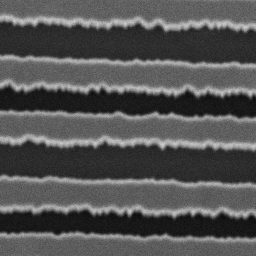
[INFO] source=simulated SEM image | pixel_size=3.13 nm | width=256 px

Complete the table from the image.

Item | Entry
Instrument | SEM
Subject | lines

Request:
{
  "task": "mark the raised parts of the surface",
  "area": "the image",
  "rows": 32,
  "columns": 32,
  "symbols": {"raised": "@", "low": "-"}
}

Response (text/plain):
@@@@@@@@@@@@@@@@@@@@@@@@@@@@@@@@
@@@@@@@@@@@@@@@@@@@@@@@@@@@@@@@@
@@@@@@@@@@@@@@@@@@@@@@@@@@@@@@@@
------------------@-@@@------@@@
--------------------------------
--------------------------------
--------------------------------
@@@@@@@@@@@@@@------------------
@@@@@@@@@@@@@@@@@@@@@@@@@@@@@@@@
@@@@@@@@@@@@@@@@@@@@@@@@@@@@@@@@
@@@@@@@@@@@@@@@@@@@@@@@@@@@@@@@@
----------@---@--@@@@@@-@@@@@@@@
--------------------------------
--------------------------------
@@@@@@@@@@@@@@@@-@@@@@@-----@---
@@@@@@@@@@@@@@@@@@@@@@@@@@@@@@@@
@@@@@@@@@@@@@@@@@@@@@@@@@@@@@@@@
@@@-@@@@@@@@@@@@@@@@@@@@@@@@@@@@
----------------------------@@@@
--------------------------------
--------------------------------
--------------------------------
@@@@@@@@@@---@-@@-@@------------
@@@@@@@@@@@@@@@@@@@@@@@@@@@@@@@@
@@@@@@@@@@@@@@@@@@@@@@@@@@@@@@@@
@@@@@@@@@@@@@@@@@@@@@@@@@@@@@@@@
@---@--@@--@@@@@@@@@@@@@@@@@@@@@
--------------------------------
--------------------------------
@@@@@@@@@@@@@@@@@--@@-----------
@@@@@@@@@@@@@@@@@@@@@@@@@@@@@@@@
@@@@@@@@@@@@@@@@@@@@@@@@@@@@@@@@